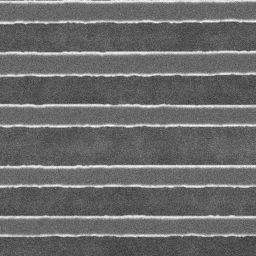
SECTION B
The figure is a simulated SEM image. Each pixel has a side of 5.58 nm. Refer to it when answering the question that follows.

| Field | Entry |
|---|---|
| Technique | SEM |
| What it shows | lines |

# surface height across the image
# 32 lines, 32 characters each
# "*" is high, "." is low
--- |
********************************
********************************
********************************
................................
................................
................................
............................*..*
********************************
********************************
................................
................................
................................
................................
********************************
********************************
********************************
................................
................................
................................
................................
................................
********************************
********************************
................................
................................
................................
................................
********************************
********************************
******.***..*.********...**.***.
................................
................................